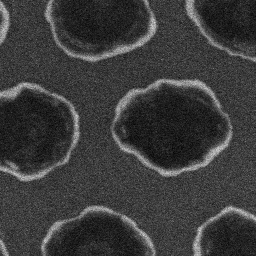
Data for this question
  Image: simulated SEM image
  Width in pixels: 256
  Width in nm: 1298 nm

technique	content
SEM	raised bodies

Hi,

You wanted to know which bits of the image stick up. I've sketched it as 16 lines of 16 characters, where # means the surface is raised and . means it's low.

...######...####
...#######..####
...######....###
.....##........#
................
.##......####...
####....######..
#####..#######..
#####..#######..
####....######..
###.......##....
................
................
.....###......##
...######...####
...#######..####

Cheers